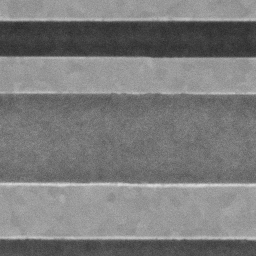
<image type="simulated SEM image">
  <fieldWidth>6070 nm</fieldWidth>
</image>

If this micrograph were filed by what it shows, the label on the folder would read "lines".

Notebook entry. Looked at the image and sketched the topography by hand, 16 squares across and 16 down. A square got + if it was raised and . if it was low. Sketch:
++++++++++++++++
................
................
................
++++++++++++++++
++++++++++++++++
................
................
................
................
................
++++++++........
++++++++++++++++
++++++++++++++++
++++++++++++++++
................